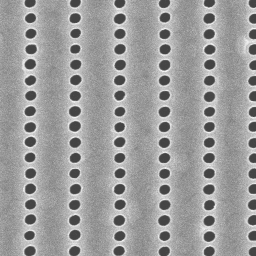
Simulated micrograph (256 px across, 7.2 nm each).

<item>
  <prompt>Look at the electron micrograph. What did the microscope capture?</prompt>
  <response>a regular array of holes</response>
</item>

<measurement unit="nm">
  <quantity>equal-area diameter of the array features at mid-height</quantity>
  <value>76.2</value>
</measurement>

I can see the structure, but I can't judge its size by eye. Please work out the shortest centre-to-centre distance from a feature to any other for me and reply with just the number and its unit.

110 nm